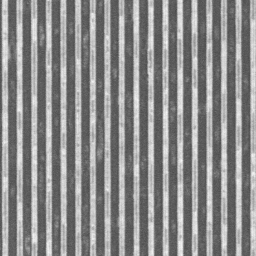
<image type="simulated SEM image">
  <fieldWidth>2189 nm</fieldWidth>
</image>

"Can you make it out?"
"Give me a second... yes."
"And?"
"parallel lines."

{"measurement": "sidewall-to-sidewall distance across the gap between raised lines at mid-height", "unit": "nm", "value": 91.9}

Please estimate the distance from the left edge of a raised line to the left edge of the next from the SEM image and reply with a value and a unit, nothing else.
125 nm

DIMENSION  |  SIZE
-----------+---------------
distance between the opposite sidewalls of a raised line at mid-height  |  33.1 nanometres